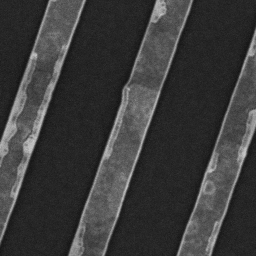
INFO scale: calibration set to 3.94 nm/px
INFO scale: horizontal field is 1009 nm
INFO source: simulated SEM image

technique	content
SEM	one or a few lines or trenches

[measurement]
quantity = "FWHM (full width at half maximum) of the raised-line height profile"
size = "125 nm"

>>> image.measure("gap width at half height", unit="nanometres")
277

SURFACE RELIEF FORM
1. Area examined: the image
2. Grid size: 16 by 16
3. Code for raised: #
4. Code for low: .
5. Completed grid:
...##.....##....
...##....##.....
..##.....##.....
..##.....##....#
..##....##.....#
.##.....##.....#
.##.....##....##
.##....##.....##
##.....##.....##
##.....##....##.
##....##.....##.
#.....##.....##.
#.....##....##..
#....##.....##..
.....##.....##..
....###....##...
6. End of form